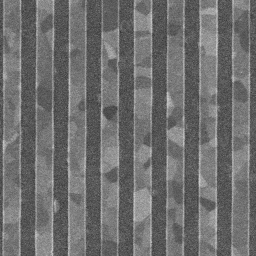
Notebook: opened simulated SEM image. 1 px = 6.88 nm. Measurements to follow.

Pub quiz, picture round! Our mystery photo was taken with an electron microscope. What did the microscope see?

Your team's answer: parallel lines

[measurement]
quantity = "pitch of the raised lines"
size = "225 nanometers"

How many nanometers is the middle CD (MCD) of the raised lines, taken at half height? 118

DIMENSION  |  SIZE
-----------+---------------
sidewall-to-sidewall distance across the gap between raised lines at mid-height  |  0.11 micrometres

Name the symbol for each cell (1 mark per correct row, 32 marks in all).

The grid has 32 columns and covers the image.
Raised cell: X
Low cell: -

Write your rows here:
-XX--XX--XX--XX--XX--XX--XX--XX-
-XX--XX--XX--XX--XX--XX--XX--XX-
-XX--XX--XX--XX--XX--XX--XX--XX-
-XX--XX--XX--XXX-XX--XX--XX--XX-
XXX--XX--XX--XX--XX--XX--XX--XX-
XXX--XX--XX--XX--XX--XX--XX--XX-
XXX--XX--XX--XX--XX--XX--XX--XX-
XXX--XX--XX--XX--XX--XX--XX--XX-
XXX--XX--XX--XX--XX--XX--XX--XX-
XXX--XX--XX--XX--XX--XX--XX--XX-
-X---XX--XX--XX--XX--XX--XX--XX-
-X---XX--XX--XX--XX--XX--XX--XX-
-X---XX--XX--XX--XX--XX--XX--XX-
-X---XX--XX--XX--XX--XX--XX--XX-
-X---XX--XX--XX--XX--XX--XX--XX-
-X---XX--XX--XX--XX--XX--XX--XX-
-XX--XX--XX--XX--XX--XX--XX--XX-
XXX--XX--XX--XX--XX--XX--XX--XX-
XX---XX--XX--XX--XX--XX--XX--XX-
XX---XX--XX--XX--XX--XX--XX--XX-
XX---XX--XX--XX--XX--XX--XX--XX-
XX---XX--XX--XX--XX--XX--XX--XX-
XXX--XX--XX--XX--XX--XX--XX--XX-
XXX--XX--XX--XX--XX--XX--XX--XX-
XXX--XX--XX--XX--XX--XX--XX--XX-
XXX--XX--XX--XX--XX--XX--XX--XX-
XX---XX--XX--XX--XX--XX--XX--XX-
XX--XXX--XX--XX--XX--XX--XX--XX-
XX--XXX--XX--XX--XX--XX--XX--XX-
XX--XXX--XX--XX--XX--XX--XX--XX-
XX--XXX--XX--XX--XX--XX--XX--XX-
XX---XX--XX--XX--XX--XX--XX--XX-